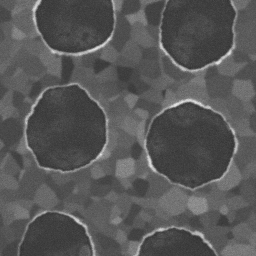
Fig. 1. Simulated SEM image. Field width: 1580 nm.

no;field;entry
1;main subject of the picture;holes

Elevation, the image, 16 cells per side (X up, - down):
XX-----XXX-----X
XX-----XXX-----X
XXX----XXX-----X
XXXXXXXXXXX---XX
XXXXXXXXXXXXXXXX
XXX--XXXXXXXXXXX
XX----XXXXX-XXXX
XX-----XXX----XX
XX-----XX------X
XX----XXX------X
XXX--XXXXX----XX
XXXXXXXXXXX--XXX
XXXXXXXXXXXXXXXX
XX--XXXXXXXXXXXX
XX---XXXXX--XXXX
X----XXXX----XXX